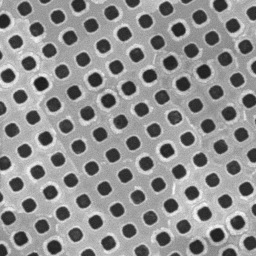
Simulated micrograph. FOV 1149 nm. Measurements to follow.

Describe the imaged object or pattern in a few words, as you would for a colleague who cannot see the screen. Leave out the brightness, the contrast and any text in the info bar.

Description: a regular array of holes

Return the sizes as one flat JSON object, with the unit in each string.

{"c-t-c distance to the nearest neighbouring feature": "24 px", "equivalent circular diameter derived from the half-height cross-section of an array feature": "70.6 nm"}